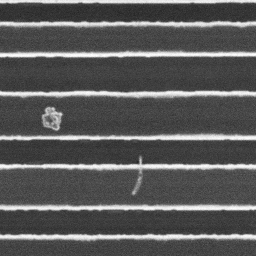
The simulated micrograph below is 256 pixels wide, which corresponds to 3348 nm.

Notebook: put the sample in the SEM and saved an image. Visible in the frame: lines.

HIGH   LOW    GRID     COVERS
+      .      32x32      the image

................................
................................
................................
++++++++++++++++++++++++++++++++
++++++++++++++++++++++++++++++++
++++++++++++++++++++++++++++++++
++++++++++++++++++++++++++++++++
................................
................................
................................
................................
................................
++++++++++++++++++++++++++++++++
++++++++++++++++++++++++++++++++
++++++++++++++++++++++++++++++++
++++++++++++++++++++++++++++++++
++++++++++++++++++++++++++++++++
................................
................................
................................
................................
++++++++++++++++++++++++++++++++
++++++++++++++++++++++++++++++++
++++++++++++++++++++++++++++++++
++++++++++++++++++++++++++++++++
++++++++++++++++++++++++++++++++
................................
................................
................................
..................+......++..+..
++++++++++++++++++++++++++++++++
++++++++++++++++++++++++++++++++